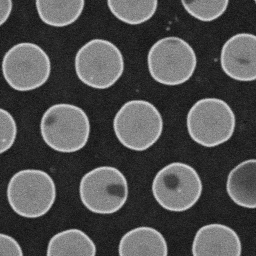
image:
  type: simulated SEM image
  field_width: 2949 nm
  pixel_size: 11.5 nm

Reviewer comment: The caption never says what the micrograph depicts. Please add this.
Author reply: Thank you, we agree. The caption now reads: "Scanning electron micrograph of an array of small figures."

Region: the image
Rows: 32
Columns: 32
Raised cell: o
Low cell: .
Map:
o....ooooo....oooooo...ooooo....
o....ooooo....ooooo.....oooo....
o....oooo......ooo.......oo.....
................................
.............................ooo
..oo.......ooo.....oooo.....oooo
.oooo.....ooooo....ooooo....oooo
oooooo...oooooo....ooooo....oooo
oooooo....ooooo....ooooo....oooo
.ooooo....ooooo....ooooo.....ooo
.oooo......ooo.......o..........
................................
.........................oo.....
......oooo.....oooo.....ooooo...
o....oooooo....ooooo....ooooo...
oo...oooooo...oooooo...oooooo...
oo...oooooo...oooooo....ooooo...
oo....ooooo....ooooo....oooo....
o......ooo......oo..............
................................
......................o.......oo
...oo......oooo.....oooo.....ooo
.ooooo....oooooo...oooooo....ooo
.oooooo...oooooo...oooooo...oooo
.oooooo...oooooo...oooooo....ooo
.ooooo.....oooo.....oooo......oo
..oooo......oo..................
................................
.................oo......oooo...
o......oooo.....oooo.....ooooo..
oo....oooooo...oooooo...oooooo..
ooo...oooooo...oooooo...oooooo..